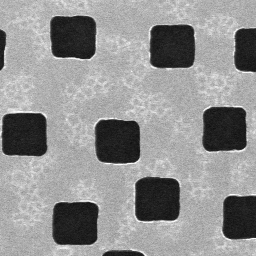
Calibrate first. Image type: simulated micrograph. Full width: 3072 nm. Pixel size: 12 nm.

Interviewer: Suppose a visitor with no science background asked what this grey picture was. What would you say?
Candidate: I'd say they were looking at holes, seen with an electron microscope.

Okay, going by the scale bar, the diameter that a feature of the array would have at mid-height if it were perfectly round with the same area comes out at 0.585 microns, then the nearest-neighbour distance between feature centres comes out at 1120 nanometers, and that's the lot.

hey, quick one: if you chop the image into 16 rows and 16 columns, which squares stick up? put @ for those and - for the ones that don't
@@@@@@@@@@@@@@@@
@@@---@@@@@@@@@@
@@@---@@@---@@@-
@@@@--@@@---@@@-
@@@@@@@@@@@@@@@-
@@@@@@@@@@@@@@@@
@@@@@@@@@@@@@@@@
---@@@@@@@@@@--@
---@@@---@@@@--@
---@@@---@@@@@@@
@@@@@@@@@@@@@@@@
@@@@@@@@@--@@@@@
@@@@@@@@---@@@--
@@@---@@@--@@@--
@@@---@@@@@@@@--
@@@@@@@@@@@@@@@@